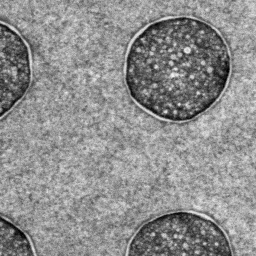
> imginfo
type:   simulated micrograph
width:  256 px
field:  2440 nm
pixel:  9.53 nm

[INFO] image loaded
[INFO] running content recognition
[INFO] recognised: holes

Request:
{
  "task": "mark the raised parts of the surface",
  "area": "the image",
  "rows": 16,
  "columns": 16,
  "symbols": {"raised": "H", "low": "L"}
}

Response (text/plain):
HHHHHHHHHHHHHHHH
HHHHHHHHHLLLLHHH
LHHHHHHHLLLLLLHH
LLHHHHHHLLLLLLHH
LLHHHHHHLLLLLLHH
LLHHHHHHLLLLLLHH
LHHHHHHHHLLLLHHH
HHHHHHHHHHHLHHHH
HHHHHHHHHHHHHHHH
HHHHHHHHHHHHHHHH
HHHHHHHHHHHHHHHH
HHHHHHHHHHHHHHHH
HHHHHHHHHHHHHHHH
HHHHHHHHHHLLLHHH
LHHHHHHHHLLLLLHH
LLHHHHHHLLLLLLHH